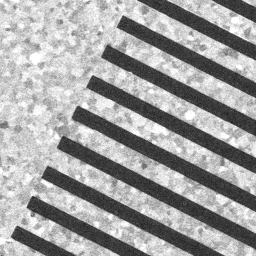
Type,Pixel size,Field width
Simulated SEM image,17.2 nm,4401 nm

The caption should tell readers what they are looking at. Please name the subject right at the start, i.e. parallel lines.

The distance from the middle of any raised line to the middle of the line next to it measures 577 nanometers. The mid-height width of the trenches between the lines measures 255 nanometres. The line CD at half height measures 322 nanometers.